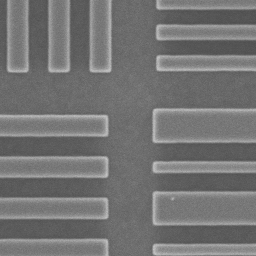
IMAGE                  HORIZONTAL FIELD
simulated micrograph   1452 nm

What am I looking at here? groups of lines, slits or small figures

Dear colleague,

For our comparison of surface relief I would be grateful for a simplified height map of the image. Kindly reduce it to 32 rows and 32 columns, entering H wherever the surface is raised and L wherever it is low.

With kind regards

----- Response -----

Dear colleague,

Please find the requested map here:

LHHLLLHHHLLHHHLLLLLLHHHHHHHHHHHH
LHHLLLHHHLLHHHLLLLLLLLLLLLLLLLLL
LHHLLLHHHLLHHHLLLLLLLLLLLLLLLLLL
LHHLLLHHHLLHHHLLLLLLHHHHHHHHHHHH
LHHLLLHHHLLHHHLLLLLLHHHHHHHHHHHH
LHHLLLHHHLLHHHLLLLLLLLLLLLLLLLLL
LHHLLLHHHLLHHHLLLLLLLLLLLLLLLLLL
LHHLLLHHHLLHHHLLLLLLHHHHHHHHHHHH
LHHLLLHHHLLHHHLLLLLLHHHHHHHHHHHH
LLLLLLLLLLLLLLLLLLLLLLLLLLLLLLLL
LLLLLLLLLLLLLLLLLLLLLLLLLLLLLLLL
LLLLLLLLLLLLLLLLLLLLLLLLLLLLLLLL
LLLLLLLLLLLLLLLLLLLLLLLLLLLLLLLL
LLLLLLLLLLLLLLLLLLLLLLLLLLLLLLLL
LLLLLLHLLLLLLLLLLLLHHHHHHHHHHHHH
HHHHHHHHHHHHHLLLLLLHHHHHHHHHHHHH
HHHHHHHHHHHHHLLLLLLHHHHHHHHHHHHH
LLLLLLLLLLLLLLLLLLLHHHHHHHHHHHHH
LLLLLLLLLLLLLLLLLLLLLLLLLLLLLLLL
LLLLLLLLLLLLLLLLLLLLLLLLLLLLLLLL
HHHHHHHHHHHHHLLLLLLHHHHHHHHHHHHH
HHHHHHHHHHHHHLLLLLLLLHHHLLLLLLLL
LLLLLLLLLLLLLLLLLLLLLLLLLLLLLLLL
LLLLLLLLLLLLLLLLLLLLLLLLLLLLLLLL
LLLLLLLLLLLLLLLLLLLHHHHHHHHHHHHH
HHHHHHHHHHHHHLLLLLLHHHHHHHHHHHHH
HHHHHHHHHHHHHLLLLLLHHHHHHHHHHHHH
LLLLLLLLLLLLLLLLLLLHHHHHHHHHHHHH
LLLLLLLLLLLLLLLLLLLLLLLLLLLLLLLL
LLLLLLLLLLLLLLLLLLLLLLLLLLLLLLLL
HHHHHHHHHHHHHLLLLLLLLLLLLLLLLLLL
HHHHHHHHHHHHHLLLLLLHHHHHHHHHHHHH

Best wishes